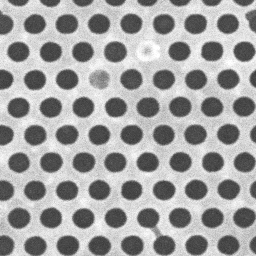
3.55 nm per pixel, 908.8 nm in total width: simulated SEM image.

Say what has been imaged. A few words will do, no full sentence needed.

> a regular array of holes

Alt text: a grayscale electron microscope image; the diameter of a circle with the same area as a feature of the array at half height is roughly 0.0773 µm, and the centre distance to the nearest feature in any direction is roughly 112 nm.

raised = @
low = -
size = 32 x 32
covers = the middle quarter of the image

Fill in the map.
@@@@@@@@@@@@@@@@@@@@@@@@@@@@@@@@
--@@@@@@@@@@@@@@--@@@@@@@-@@@@@@
---@@@@@@@@@@@-----@@@@-----@@@-
----@@@@@@@@@@------@@------@@--
----@@@@@@@@@@------@@------@@--
---@@@@@@@@@@@@----@@@@----@@@@-
-@@@@@@@@@@@@@@@-@@@@@@@--@@@@@@
@@@@@@@@@@@@@@@@@@@@@@@@@@@@@@@@
@@@---@@@@@@--@@@@@@--@@@@@@---@
@@-----@@@-----@@@@----@@@------
@@------@@------@@------@@------
@@------@@------@@------@@------
@@-----@@@@----@@@@----@@@@----@
@@@@@@@@@@@@@@@@@@@@@@@@@@@@@@@@
@@@@@@@@@@@@@@@@@@@@@@@@@@@@@@@@
--@@@@@@--@@@@@@---@@@@---@@@@@-
---@@@-----@@@------@@-----@@@--
----@@------@@------@@------@@--
---@@@-----@@@------@@------@@--
---@@@@----@@@@----@@@@----@@@@-
@@@@@@@@@@@@@@@@@@@@@@@@-@@@@@@@
@@@@@@@@@@@@@@@@@@@@@@@@@@@@@@@@
@@@----@@@@----@@@@----@@@@----@
@@------@@@-----@@-----@@@@-----
@@------@@------@@------@@------
@@------@@------@@------@@@-----
@@@----@@@@----@@@@----@@@@----@
@@@@@@@@@@@@@@@@@@@@@@@@@@@@@@@@
@@@@@@@@@@@@@@@@@@@@@@@@@@@@@@@@
---@@@@----@@@@----@@@@----@@@@-
---@@@-----@@@-----@@@------@@--
----@@------@@------@@------@@--